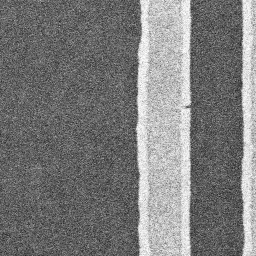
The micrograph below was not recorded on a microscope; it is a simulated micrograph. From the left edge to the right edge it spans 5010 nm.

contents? one or a few lines or trenches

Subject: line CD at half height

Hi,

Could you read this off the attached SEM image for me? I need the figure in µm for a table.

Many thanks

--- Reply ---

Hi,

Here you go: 0.849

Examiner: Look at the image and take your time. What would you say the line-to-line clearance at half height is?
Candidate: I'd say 1.18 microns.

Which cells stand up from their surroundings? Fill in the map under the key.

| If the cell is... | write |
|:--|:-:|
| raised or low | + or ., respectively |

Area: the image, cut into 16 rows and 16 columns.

.........+++...+
.........+++...+
.........+++...+
.........+++...+
.........+++...+
.........+++...+
.........+++...+
.........+++...+
.........+++...+
.........+++...+
.........+++...+
.........+++...+
.........+++...+
.........+++...+
.........+++...+
.........+++...+